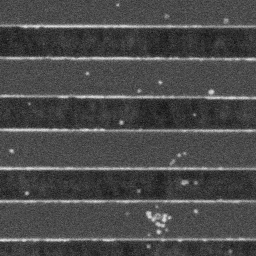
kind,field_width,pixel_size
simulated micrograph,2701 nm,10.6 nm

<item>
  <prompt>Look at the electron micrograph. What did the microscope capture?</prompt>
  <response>lines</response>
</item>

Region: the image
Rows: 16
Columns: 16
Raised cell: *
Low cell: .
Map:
****************
****************
................
................
****************
****************
................
................
****************
****************
****************
................
................
****************
****************
................